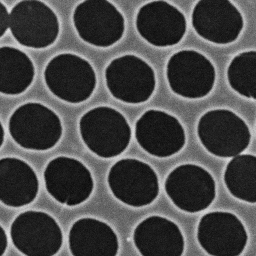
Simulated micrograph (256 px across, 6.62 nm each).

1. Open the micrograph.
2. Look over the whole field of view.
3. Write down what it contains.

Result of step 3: a regular array of holes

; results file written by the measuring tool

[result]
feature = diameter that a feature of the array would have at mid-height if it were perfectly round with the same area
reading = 324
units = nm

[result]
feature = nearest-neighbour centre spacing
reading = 385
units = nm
